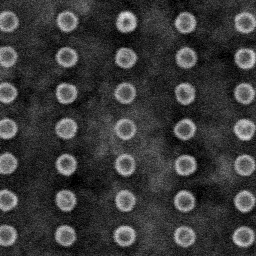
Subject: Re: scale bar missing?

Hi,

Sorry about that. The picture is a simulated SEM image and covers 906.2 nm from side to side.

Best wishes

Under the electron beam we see a regular array of raised bodies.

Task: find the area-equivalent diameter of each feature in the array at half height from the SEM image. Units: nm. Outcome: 68.2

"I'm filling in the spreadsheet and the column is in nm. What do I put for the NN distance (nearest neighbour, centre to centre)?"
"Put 126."